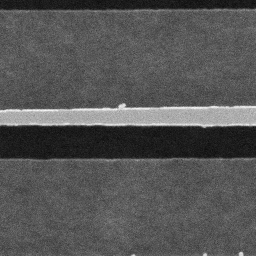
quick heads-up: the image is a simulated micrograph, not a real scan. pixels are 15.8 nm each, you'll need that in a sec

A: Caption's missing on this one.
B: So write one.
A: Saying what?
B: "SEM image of lines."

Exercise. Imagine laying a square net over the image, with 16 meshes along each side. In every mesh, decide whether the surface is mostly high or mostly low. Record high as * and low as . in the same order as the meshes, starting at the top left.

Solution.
................
****************
****************
****************
****************
****************
****************
****************
................
................
****************
****************
****************
****************
****************
****************